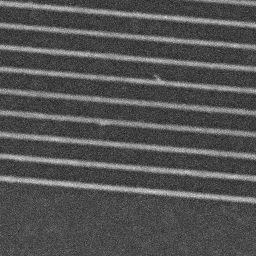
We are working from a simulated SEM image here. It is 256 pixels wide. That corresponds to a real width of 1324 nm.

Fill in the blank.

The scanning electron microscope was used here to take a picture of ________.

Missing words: parallel lines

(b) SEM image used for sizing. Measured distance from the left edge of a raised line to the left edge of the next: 21.8 pixels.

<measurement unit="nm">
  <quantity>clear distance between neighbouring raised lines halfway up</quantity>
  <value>96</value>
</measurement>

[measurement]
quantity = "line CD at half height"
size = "18 nm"